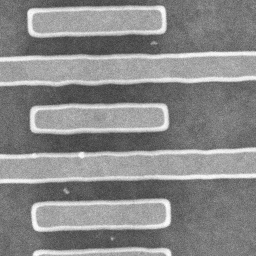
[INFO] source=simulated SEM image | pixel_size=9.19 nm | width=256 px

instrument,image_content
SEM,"groups of lines, slits or small figures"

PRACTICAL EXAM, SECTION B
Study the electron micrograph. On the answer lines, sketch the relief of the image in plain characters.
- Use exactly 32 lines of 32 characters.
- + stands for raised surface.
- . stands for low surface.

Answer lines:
................................
....++++++++++++++++............
....++++++++++++++++............
....++++++++++++++++............
................................
................................
................................
++++++++++++++++++++++++++++++++
++++++++++++++++++++++++++++++++
++++++++++++++++++++++++++++++++
................................
................................
................................
.....+++++++++++++++............
....+++++++++++++++++...........
....+++++++++++++++++...........
.......++.......................
................................
................................
....++++++++++++++++++++++++++++
++++++++++++++++++++++++++++++++
++++++++++++++++++++++++++++++++
+++++++.........................
................................
................................
.....++++++++++++++++...........
....+++++++++++++++++...........
....+++++++++++++++++...........
.....+++++++....................
................................
................................
..........+++++++++++...........